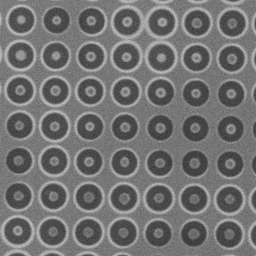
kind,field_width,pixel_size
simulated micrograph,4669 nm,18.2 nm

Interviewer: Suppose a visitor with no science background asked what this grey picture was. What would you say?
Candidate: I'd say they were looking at an array of small figures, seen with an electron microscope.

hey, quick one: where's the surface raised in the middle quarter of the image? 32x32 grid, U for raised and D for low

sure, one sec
UUUUDDDDDUUUUDDDDDUUUDDDDDDUUUDD
UUUUUUDDUUUUUUDDDUUUUUDDDDUUUUUD
UUUUUUUUUUUUUUUUUUUUUUUUUUUUUUUU
UUUUUUDDUUUUUUDDUUUUUUUUDUUUUUUU
DUUUDDDDDUUUUDDDDDUUUUDDDDDUUUUD
DUUDDDDDDDUUDDDDDDDUUDDDDDDUUUDD
DUUDDDUUDDUUDDDUDDDUUDDUUDDDUUDD
DUUDDDUUDDUUDDDUDDDUUDDUUDDDUDDD
DUUUDDDDDDUUDDDDDDDUUDDDDDDUUUDD
UUUUDDDDDUUUUDDDDDUUUUDDDDDUUUDD
UUUUUUUUUUUUUUUDUUUUUUUUDUUUUUUU
UUUUUUUUUUUUUUUUUUUUUUUUUUUUUUUU
UUUUUDDDUUUUUUDDUUUUUUUUUUUUUUUU
DUUUDDDDDUUUUDDDDDUUUUDDDDUUUUUD
DUUDDDDDDDUUDDDDDDUUUDDDDDDUUUDD
DUUDDDUDDDUUDDUUDDDUUDDUUDDUUUDD
DUUDDDDDDDUUDDUUDDDUUDDUUDDUUUDD
DUUDDDDDDUUUDDDDDDUUUDDDDDDUUUDD
UUUUDDDDDUUUUDDDDUUUUUDDDDUUUUUD
UUUUUUUUUUUUUUUUUUUUUUUUUUUUUUUU
UUUUUUUUUUUUUUUUUUUUUUUUUUUUUUUU
UUUUUDDDUUUUUDDDUUUUUUUDDUUUUUUU
DUUUDDDDDUUUDDDDDDUUUUDDDDUUUUDD
DUUDDDUDDDUUDDDDDDUUUDDDDDDUUUDD
DUUDDUUDDDUUDDUUDDDUUDDUUDDUUDDD
DUUDDDDDDDUUDDDDDDUUUDDUUDDUUDDD
UUUDDDDDDUUUDDDDDDUUUDDDDDDUUUDD
UUUUDDDDUUUUUDDDDUUUUUDDDDUUUUUD
UUUUUUUUUUUUUUUUUUUUUUUUUUUUUUUU
UUUUUUUUUUUUUUUUUUUUUUUUUUUUUUUU
UUUUDDDDUUUUUDDDDUUUUUDDDUUUUUUD
DUUDDDDDDUUUDDDDDDUUUDDDDDDUUUDD